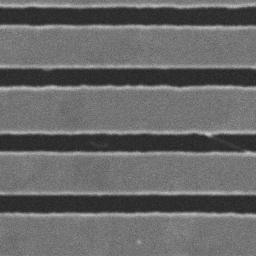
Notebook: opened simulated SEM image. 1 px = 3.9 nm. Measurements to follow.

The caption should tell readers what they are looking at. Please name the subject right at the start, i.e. lines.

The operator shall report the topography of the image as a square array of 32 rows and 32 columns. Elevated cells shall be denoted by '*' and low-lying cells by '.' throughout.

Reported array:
********************************
................................
................................
********************************
********************************
********************************
********************************
********************************
....................*..........*
................................
................................
********************************
********************************
********************************
********************************
********************************
********************************
................................
................................
********************************
********************************
********************************
********************************
********************************
................................
................................
................................
********************************
********************************
********************************
********************************
********************************